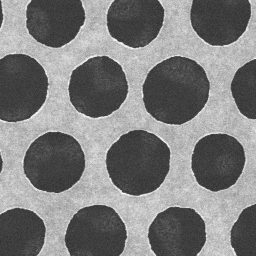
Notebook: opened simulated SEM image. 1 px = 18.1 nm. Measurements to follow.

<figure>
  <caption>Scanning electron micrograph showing holes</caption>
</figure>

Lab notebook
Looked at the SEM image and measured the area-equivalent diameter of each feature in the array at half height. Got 1120 nanometres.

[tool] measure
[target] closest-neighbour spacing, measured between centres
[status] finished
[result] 1440 nm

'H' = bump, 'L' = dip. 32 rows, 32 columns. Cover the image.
HHHLLLLLLLHHHHLLLLLLHHHHLLLLLLLH
HHHLLLLLLLLHHLLLLLLLLHHHLLLLLLLH
HHHLLLLLLLLHHLLLLLLLHHHHLLLLLLLH
HHHLLLLLLLHHHLLLLLLLHHHHLLLLLLLH
HHHHLLLLLLHHHHLLLLLLHHHHHLLLLLHH
HHHHHLLLHHHHHHHLLLLHHHHHHHLLLHHH
HHHHHHHHHHHHHHHHHHHHHHHHHHHHHHHH
LLLLLHHHHHHLLLHHHHHHLLLLHHHHHHHL
LLLLLHHHHLLLLLLHHHHLLLLLLHHHHHLL
LLLLLLHHHLLLLLLLHHLLLLLLLLHHHLLL
LLLLLLHHHLLLLLLLHHLLLLLLLLHHHLLL
LLLLLLHHHLLLLLLLHHLLLLLLLLHHHLLL
LLLLLLHHHLLLLLLLHHLLLLLLLLHHHLLL
LLLLLHHHHLLLLLLHHHLLLLLLLHHHHHLL
LLLLHHHHHHHLLHHHHHHLLLLLLHHHHHLL
HHHHHHHHHHHHHHHHHHHHHLLHHHHHHHHH
HHHHHHLLHHHHHHHHLLLHHHHHHHHHHHHH
HHHHLLLLLLHHHHHLLLLLHHHHHLLLLLHH
HHHHLLLLLLHHHHLLLLLLLHHHLLLLLLHH
HHHLLLLLLLLHHLLLLLLLLHHHLLLLLLLH
HHHLLLLLLLLHHLLLLLLLLHHHLLLLLLLH
HHHLLLLLLLHHHLLLLLLLLHHHLLLLLLHH
HHHHLLLLLLHHHHLLLLLLLHHHHLLLLLHH
HHHHLLLLLHHHHHHLLLLLHHHHHHLLLHHH
HHHHHHHHHHHHHHHHHHHHHHHHHHHHHHHH
HHHHHHHHHHHHHHHHHHHHHHHHHHHHHHHH
LLLLHHHHHHLLLLLHHHHHLLLLLHHHHHLL
LLLLLHHHHLLLLLLHHHHLLLLLLHHHHHLL
LLLLLLHHLLLLLLLLHHHLLLLLLLHHHLLL
LLLLLLHHLLLLLLLLHHLLLLLLLLHHHLLL
LLLLLLHHLLLLLLLLHHHLLLLLLLHHHLLL
LLLLLHHHHLLLLLLHHHHLLLLLLHHHHLLL